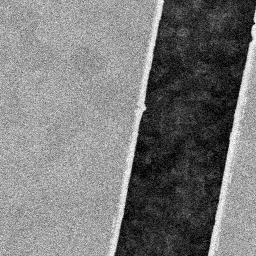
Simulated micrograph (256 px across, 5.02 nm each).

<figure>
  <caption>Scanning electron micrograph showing one or a few lines or trenches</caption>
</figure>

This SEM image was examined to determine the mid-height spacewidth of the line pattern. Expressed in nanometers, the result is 484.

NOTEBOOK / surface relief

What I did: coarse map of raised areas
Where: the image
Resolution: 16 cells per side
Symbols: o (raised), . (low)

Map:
oooooooooo......
oooooooooo......
oooooooooo......
ooooooooo.......
ooooooooo......o
ooooooooo......o
ooooooooo......o
ooooooooo......o
oooooooo.......o
oooooooo......oo
oooooooo......oo
oooooooo......oo
oooooooo......oo
oooooooo......oo
ooooooo......ooo
ooooooo......ooo